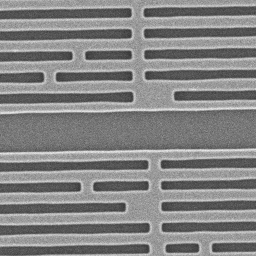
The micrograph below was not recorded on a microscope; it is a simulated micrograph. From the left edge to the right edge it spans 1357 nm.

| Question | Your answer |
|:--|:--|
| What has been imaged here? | groups of lines, slits or small figures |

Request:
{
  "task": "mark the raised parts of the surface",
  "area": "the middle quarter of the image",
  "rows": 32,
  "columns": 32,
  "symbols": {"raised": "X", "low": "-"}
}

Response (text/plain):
XXXXXXXXXXXXXXXXXXXXXXXXXXXXXXXX
XXXXXXXXXXXXXXXXXXXXXXXXXXX-----
-----------------XXX------------
-----------------XXX------------
-XXXXXXXXXXXXXXXXXXXXXXXXXXXXXXX
XXXXXXXXXXXXXXXXXXXXXXXXXXXXXXXX
XXXXXXXXXXXXXXXXXXXXXXXXXXXXXXXX
-----------------XXXXXXXXXX-----
------------------XXXXXXXXX-----
-----------------XXXXXXXXXXXXXXX
XXXXXXXXXXXXXXXXXXXXXXXXXXXXXXXX
XXXXXXXXXXXXXXXXXXXXXXXXXX-XXXXX
--------------------------------
--------------------------------
--------------------------------
--------------------------------
--------------------------------
--------------------------------
--------------------------------
--------------------------------
--------------------------------
--------------------------------
XXXXXXXXXXXXXXXXXXXXXXXXXXXXXXXX
XXXXXXXXXXXXXXXXXXXXXXXXXXXXXXXX
---------------------XXX--------
---------------------XXX--------
--------------------XXXXXXXXXXXX
XXXXXXXXXXXXXXXXXXXXXXXXXXXXXXXX
XXXXXXXXXXXXXXXXXXXXXXXXXXXXXXXX
----XXXX-------------XXX--------
----XXX--------------XXX--------
----XXX--------------XXXX-XXXXXX